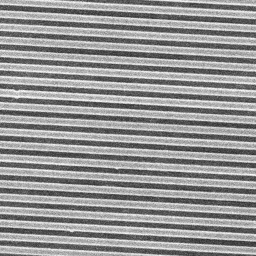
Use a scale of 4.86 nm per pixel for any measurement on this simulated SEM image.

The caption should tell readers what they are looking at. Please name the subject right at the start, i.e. parallel lines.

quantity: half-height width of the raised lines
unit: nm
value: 32.7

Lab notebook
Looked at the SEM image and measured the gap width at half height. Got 28.5 nm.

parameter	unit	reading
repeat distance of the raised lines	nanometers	63.4